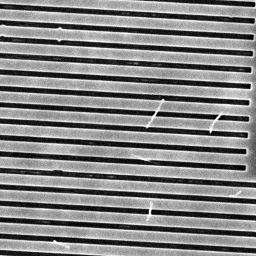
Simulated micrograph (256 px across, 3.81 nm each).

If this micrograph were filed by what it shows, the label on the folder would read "parallel lines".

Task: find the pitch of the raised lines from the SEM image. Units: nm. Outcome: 62.4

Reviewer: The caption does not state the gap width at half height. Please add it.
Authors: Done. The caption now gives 0.0223 um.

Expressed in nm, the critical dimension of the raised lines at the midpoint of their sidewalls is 41.3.